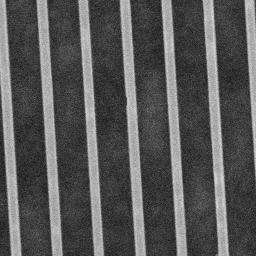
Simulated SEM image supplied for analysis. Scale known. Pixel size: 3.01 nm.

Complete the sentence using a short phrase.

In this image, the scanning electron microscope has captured parallel lines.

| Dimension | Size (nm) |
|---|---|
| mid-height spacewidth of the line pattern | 96.5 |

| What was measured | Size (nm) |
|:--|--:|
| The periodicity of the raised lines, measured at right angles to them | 125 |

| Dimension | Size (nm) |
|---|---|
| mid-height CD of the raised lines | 27.4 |